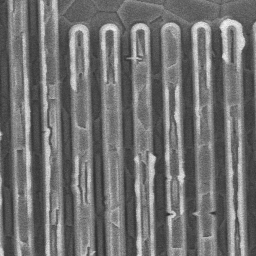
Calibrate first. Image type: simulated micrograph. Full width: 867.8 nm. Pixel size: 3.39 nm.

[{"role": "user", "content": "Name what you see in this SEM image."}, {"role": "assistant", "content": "parallel lines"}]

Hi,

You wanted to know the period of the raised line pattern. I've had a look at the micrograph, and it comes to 103 nanometers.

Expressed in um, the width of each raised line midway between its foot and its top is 0.0575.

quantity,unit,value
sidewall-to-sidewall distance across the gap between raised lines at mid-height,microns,0.0453